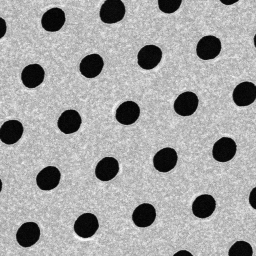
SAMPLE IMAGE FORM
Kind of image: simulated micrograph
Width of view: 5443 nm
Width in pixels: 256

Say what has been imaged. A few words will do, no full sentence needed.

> a regular array of holes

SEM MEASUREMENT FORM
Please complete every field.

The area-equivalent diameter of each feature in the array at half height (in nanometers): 519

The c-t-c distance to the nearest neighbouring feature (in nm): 1250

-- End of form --